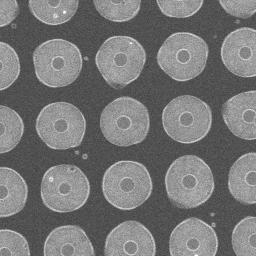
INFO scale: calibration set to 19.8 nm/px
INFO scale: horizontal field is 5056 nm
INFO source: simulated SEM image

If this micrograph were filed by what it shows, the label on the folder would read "an array of small figures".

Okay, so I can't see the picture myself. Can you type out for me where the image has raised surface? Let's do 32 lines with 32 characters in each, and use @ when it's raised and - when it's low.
--@@------@@-----@@@-----@@@----
--@@-----@@@-----@@@@---@@@@@---
-@@@@---@@@@@@--@@@@@@@@@@@@@@@@
@@@@@@@@@@@@@@@@@@@@@@@@@@@@@@@@
@@@@@@@@@@@@@@@@@@@@@---@@@@@---
@@@@@@---@@@@----@@@------@@----
--@@@-----@@------@@------@@----
--@@------@@------@@------@@----
--@@------@@------@@-----@@@----
--@@@-----@@@----@@@@---@@@@@@-@
-@@@@@---@@@@@--@@@@@@@@@@@@@@@@
@@@@@@@@@@@@@@@@@@@@@@@@@@@@@@@-
@@@@@@@@@@@@@@@--@@@@@---@@@@---
-@@@@@----@@@-----@@@-----@@----
--@@@-----@@@-----@@------@@----
---@@------@@------@------@@----
---@@-----@@@-----@@@-----@@@---
--@@@-----@@@@----@@@@---@@@@@@@
--@@@@@-@@@@@@@@@@@@@@@@@@@@@@@@
@@@@@@@@@@@@@@@@@@@@@@@@@@@@@@@-
@@@@@@@@@@@@@@---@@@@@----@@@---
--@@@@----@@@-----@@@-----@@@---
---@@------@@------@@------@@---
---@@------@@------@@------@@---
---@@------@@------@@-----@@@---
---@@@----@@@@----@@@@---@@@@@@@
--@@@@@@@@@@@@@@@@@@@@@@@@@@@@@@
@@@@@@@@@@@@@@@@@@@@@@@@-@@@@@--
@@@@@@@@--@@@@@---@@@@----@@@---
---@@@-----@@@-----@@------@@---
---@@@-----@@------@@------@@---
----@@------@------@@------@@---